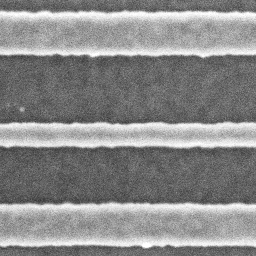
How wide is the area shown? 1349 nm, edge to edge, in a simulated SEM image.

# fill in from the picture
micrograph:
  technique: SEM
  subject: lines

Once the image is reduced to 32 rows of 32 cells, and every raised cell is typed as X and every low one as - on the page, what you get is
--------------------------------
--------------------------------
XXXXXXXXXXXXXXXXXXXXXXXXXXXXXXXX
XXXXXXXXXXXXXXXXXXXXXXXXXXXXXXXX
XXXXXXXXXXXXXXXXXXXXXXXXXXXXXXXX
XXXXXXXXXXXXXXXXXXXXXXXXXXXXXXXX
XXXXXXXXXXXXXXXXXXXXXXXXXXXXXXXX
--------------------------------
--------------------------------
--------------------------------
--------------------------------
--------------------------------
--------------------------------
--------------------------------
--------------------------------
---XX-X-----XX----XXX-------X-XX
XXXXXXXXXXXXXXXXXXXXXXXXXXXXXXXX
XXXXXXXXXXXXXXXXXXXXXXXXXXXXXXXX
--------------------------------
--------------------------------
--------------------------------
--------------------------------
--------------------------------
--------------------------------
--------------------------------
--------------------------------
XXXXXXXXXXXXXXXXXXXXXXXXXXXXXXXX
XXXXXXXXXXXXXXXXXXXXXXXXXXXXXXXX
XXXXXXXXXXXXXXXXXXXXXXXXXXXXXXXX
XXXXXXXXXXXXXXXXXXXXXXXXXXXXXXXX
XXXXXXXXXXXXXXXXXXXXXXXXXXXXXXXX
--------------------------------